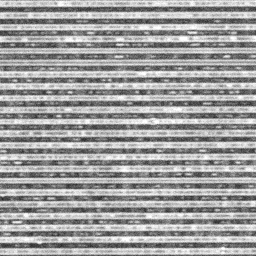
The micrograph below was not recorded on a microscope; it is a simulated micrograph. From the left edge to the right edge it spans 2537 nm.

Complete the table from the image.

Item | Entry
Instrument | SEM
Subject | parallel lines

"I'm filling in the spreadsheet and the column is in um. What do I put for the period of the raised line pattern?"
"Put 0.117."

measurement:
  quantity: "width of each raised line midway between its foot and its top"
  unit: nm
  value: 54.5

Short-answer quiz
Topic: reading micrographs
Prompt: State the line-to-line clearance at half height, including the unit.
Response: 63.2 nm